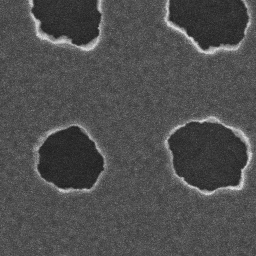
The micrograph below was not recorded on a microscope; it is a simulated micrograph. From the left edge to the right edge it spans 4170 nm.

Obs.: holes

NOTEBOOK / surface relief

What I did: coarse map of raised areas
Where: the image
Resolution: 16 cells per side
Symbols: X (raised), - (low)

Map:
XX----XXXXX----X
XX----XXXXX----X
XXXX--XXXXXX---X
XXXXXXXXXXXXXXXX
XXXXXXXXXXXXXXXX
XXXXXXXXXXXXXXXX
XXXXXXXXXXXXXXXX
XXXXXXXXXXXXXXXX
XXX---XXXXX----X
XX----XXXXX----X
XX----XXXXX----X
XXX---XXXXXX---X
XXXXXXXXXXXXXXXX
XXXXXXXXXXXXXXXX
XXXXXXXXXXXXXXXX
XXXXXXXXXXXXXXXX